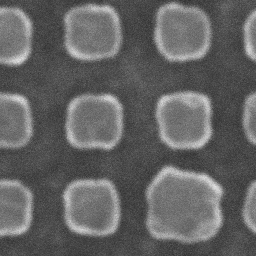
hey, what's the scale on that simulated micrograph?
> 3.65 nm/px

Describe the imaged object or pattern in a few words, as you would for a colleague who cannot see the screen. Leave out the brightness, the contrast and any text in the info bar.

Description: raised bodies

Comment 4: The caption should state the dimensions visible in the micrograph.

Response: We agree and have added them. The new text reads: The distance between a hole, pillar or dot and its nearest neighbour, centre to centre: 320 nanometers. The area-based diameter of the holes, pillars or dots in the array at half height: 204 nanometers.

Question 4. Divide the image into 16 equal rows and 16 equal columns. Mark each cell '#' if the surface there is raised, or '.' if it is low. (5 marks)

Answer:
.....#....##....
##..###...###..#
##..###...###..#
#....##...##....
................
................
##...##...###..#
##..###...###..#
##..###...###...
................
................
#....##..####...
##..###..#####.#
##..###..#####.#
#....##...###...
................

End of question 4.